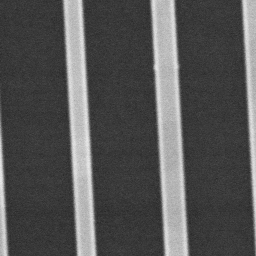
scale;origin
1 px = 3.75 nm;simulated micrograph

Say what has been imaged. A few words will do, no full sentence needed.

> one or a few lines or trenches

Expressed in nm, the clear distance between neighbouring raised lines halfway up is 266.